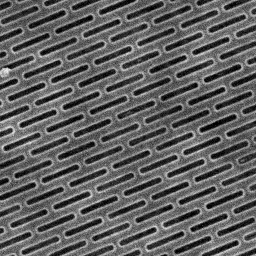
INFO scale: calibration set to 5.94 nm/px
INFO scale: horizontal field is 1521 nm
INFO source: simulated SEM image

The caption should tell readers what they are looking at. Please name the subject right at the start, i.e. a regular array of holes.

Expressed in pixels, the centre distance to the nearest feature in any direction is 27.4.